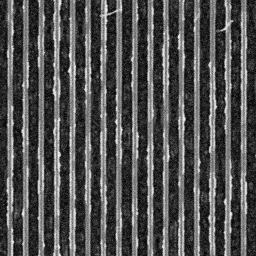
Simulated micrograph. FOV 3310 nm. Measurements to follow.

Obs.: parallel lines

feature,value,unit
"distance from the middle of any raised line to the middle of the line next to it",15.6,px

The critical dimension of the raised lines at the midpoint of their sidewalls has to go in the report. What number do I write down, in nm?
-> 66.2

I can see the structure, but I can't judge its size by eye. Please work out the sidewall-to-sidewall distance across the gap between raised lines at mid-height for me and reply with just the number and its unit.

11.1 px